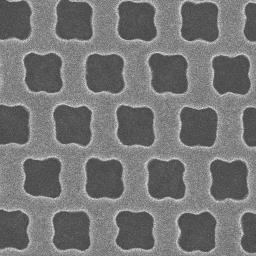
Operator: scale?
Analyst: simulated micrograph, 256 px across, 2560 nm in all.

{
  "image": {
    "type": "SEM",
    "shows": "a regular array of holes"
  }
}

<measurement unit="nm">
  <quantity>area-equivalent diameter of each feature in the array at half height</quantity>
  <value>413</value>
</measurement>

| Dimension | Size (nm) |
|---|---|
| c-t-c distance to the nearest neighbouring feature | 606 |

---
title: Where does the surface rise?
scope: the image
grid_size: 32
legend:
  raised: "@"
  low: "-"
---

---@@@@----@@@@----@@@@----@@@@-
----@@@-----@@@----@@@@----@@@@-
----@@@----@@@@----@@@@----@@@@-
----@@@-----@@@----@@@@----@@@@-
----@@@-----@@@-----@@@----@@@@-
@@@@@@@@@@@@@@@@@@@@@@@@@@@@@@@@
@@@@@@@@@@@@@@@@@@@@@@@@@@@@@@@@
@@@-----@@@----@@@@----@@@@----@
@@@-----@@@----@@@@----@@@@----@
@@@-----@@@----@@@@----@@@@----@
@@@-----@@@-----@@@----@@@@----@
@@@@@@-@@@@@-@-@@@@@---@@@@----@
@@@@@@@@@@@@@@@@@@@@@@@@@@@@@@@@
---@@@@----@@@@----@@@@-@@@@@@@-
----@@@----@@@@----@@@@----@@@--
----@@@----@@@@----@@@@----@@@--
----@@@----@@@@----@@@@----@@@--
---@@@@----@@@@----@@@@----@@@--
@@@@@@@@@@@@@@@@@@@@@@@@@@@@@@@@
@@@@@@@@@@@@@@@@@@@@@@@@@@@@@@@@
@@@-----@@@----@@@@----@@@-----@
@@@----@@@@----@@@@----@@@-----@
@@@----@@@@----@@@@----@@@@----@
@@@-----@@@-----@@-----@@@-----@
@@@@---@@@@----@@@@----@@@@----@
@@@@@@@@@@@@@@@@@@@@@@@@@@@@@@@@
---@@@@---@@@@@--@@@@@@@@@@@@@@@
----@@@----@@@@----@@@-----@@@--
---@@@@----@@@@----@@@-----@@@--
---@@@@----@@@@----@@@-----@@@--
----@@@----@@@@----@@@-----@@@--
@@@@@@@@@@@@@@@@@@@@@@@@@@@@@@@-